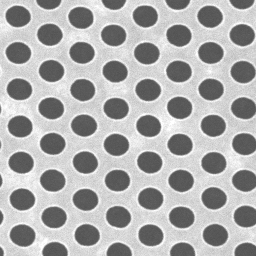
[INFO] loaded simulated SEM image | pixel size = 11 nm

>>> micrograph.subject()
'a regular array of holes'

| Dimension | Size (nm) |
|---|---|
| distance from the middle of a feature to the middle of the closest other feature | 397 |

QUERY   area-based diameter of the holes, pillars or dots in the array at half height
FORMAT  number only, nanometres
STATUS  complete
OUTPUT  266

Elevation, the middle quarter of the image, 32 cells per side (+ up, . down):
++++++++++.....+++++++++++......
++++++++++......++++++++++......
++++++++++......++++++++++......
++++++++++......++++++++++.....+
++.....+++++..+++++....+++++..++
++......++++++++++......++++++++
+.......++++++++++......++++++++
++......++++++++++......++++++++
+++....+++++..+++++....++++....+
++++++++++......++++++++++......
++++++++++......++++++++++......
++++++++++......++++++++++......
++++++++++......++++++++++......
+++....++++....++++....+++++...+
++......++++++++++......++++++++
++......++++++++++......++++++++
++......++++++++++......++++++++
+++....+++++..+++++.....++++..++
+++++++++++.....++++++++++.....+
++++++++++......++++++++++......
++++++++++......++++++++++......
++++++++++......++++++++++......
+++....++++....++++....++++....+
++......++++++++++......++++++++
++.......+++++++++.......+++++++
++......++++++++++.......+++++++
+++.....++++..+++++.....++++..++
+++++++++++.....+++++.+++++.....
++++++++++.......+++++++++......
++++++++++.......+++++++++......
+++++++++++.....++++++++++......
++++...++++....+++++....++++...+